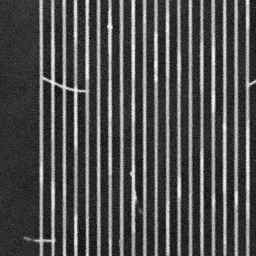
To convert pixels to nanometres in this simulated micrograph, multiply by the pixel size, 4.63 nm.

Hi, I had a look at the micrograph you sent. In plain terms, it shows parallel lines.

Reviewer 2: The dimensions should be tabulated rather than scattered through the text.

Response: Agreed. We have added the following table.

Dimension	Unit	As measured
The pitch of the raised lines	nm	53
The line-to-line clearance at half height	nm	41.7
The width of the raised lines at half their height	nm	12.7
